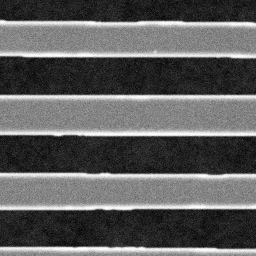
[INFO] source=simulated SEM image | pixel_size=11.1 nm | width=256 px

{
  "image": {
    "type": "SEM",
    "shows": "lines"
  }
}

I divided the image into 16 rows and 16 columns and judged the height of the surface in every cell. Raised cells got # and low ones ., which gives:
................
################
################
.###############
................
................
################
################
................
................
................
################
################
................
................
#########.......